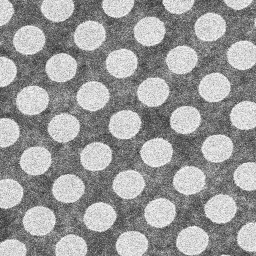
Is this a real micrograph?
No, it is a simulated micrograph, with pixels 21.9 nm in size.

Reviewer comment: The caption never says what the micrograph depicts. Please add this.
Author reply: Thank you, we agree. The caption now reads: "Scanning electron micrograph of a regular array of raised bodies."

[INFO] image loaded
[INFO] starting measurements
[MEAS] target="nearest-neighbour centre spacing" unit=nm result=930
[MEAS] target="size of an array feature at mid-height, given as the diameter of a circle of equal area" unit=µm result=0.647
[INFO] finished